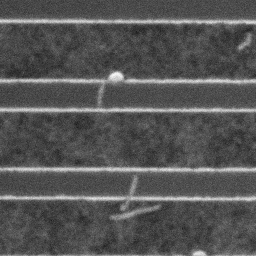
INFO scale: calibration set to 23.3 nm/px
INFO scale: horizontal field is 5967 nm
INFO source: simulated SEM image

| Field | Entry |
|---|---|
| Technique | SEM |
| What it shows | lines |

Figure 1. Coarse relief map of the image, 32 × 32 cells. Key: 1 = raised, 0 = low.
11111111111111111111111111111111
11111111111111111111111111111111
11111111111111111111111111111111
00000000000000000000000000000000
00000000000000000000000000000000
00000000000000000000000000000000
00000000000000000000000000000000
00000000000000000000000000000000
00000000000000000000000000000000
00000000000000100000000000000000
11111111111111111111111111111111
11111111111111111111111111111111
11111111111111111111111111111111
11111111111111111111111111111111
00000000000000000000000000000000
00000000000000000000000000000000
00000000000000000000000000000000
00000000000000000000000000000000
00000000000000000000000000000000
00000000000000000000000000000000
00000000000000000000000000000000
11111111111111111111111111111111
11111111111111111111111111111111
11111111111111111111111111111111
11111111111111111111111111111111
00000000000000000000000000000000
00000000000000000000000000000000
00000000000000000000000000000000
00000000000000000000000000000000
00000000000000000000000000000000
00000000000000000000000000000000
00000000000000000000000000000000